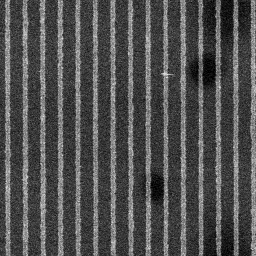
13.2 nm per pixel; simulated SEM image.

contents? parallel lines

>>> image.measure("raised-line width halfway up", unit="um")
0.051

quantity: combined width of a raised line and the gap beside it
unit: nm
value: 231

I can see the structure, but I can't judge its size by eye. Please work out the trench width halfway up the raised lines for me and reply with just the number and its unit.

184 nm